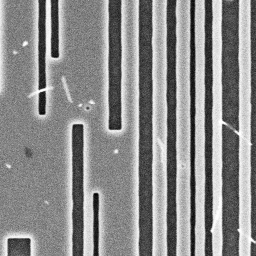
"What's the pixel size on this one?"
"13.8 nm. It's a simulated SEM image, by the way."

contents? groups of lines, slits or small figures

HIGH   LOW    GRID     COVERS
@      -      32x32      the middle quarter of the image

@@@@@@@@@@@----@@@@---@@@@--@@@-
@@@@@@@@@@@----@@@----@@@@--@@@-
@@@@@@@@@@@----@@@@---@@@@--@@@-
@@@@@@@@@@@----@@@@---@@@---@@@-
@@@@@@@@@@@---@@@@@---@@@@--@@@-
@@@@@@@@@@@---@@@@@---@@@@--@@@-
@@@@@@@@@@@---@@@@@---@@@@--@@@-
@@@@@@@@@@@---@@@@@---@@@---@@@-
@@@@@@@@@@@---@@@@@---@@@---@@@-
@@@@@@@@@@@----@@@@---@@@@--@@@-
@@@@@@@@@@@----@@@@---@@@@--@@@-
@@@@@@@@@@@----@@@@---@@@@--@@@-
@@@@@@@@@@@----@@@@---@@@@--@@@-
@@@@@@@@@@@----@@@@---@@@@--@@@-
@@@@@@@@@@@----@@@@---@@@@--@@@-
@@---@@@@@@----@@@@---@@@@--@@@-
@@---@@@@@@@--@@@@@---@@@@--@@@-
@@---@@@@@@@@@@@@@@---@@@@--@@@-
@@---@@@@@@@@@@@@@@---@@@@--@@@-
@@---@@@@@@@@@@@@@@---@@@@--@@@-
@@---@@@@@@@@@@@@@@---@@@@--@@@-
@@---@@@@@@@@@@@@@@---@@@@--@@@-
@@---@@@@@@@@@@@@@@---@@@@--@@@-
@@---@@@@@@@@@@@@@@---@@@@--@@@-
@@---@@@@@@@@@@@@@@---@@@@--@@@-
@@---@@@@@@@@@@@@@@---@@@@--@@@-
@@---@@@@@@@@@@@@@----@@@@--@@@-
@@---@@@@@@@@@@@@@----@@@@--@@@-
@@---@@@@@@@@@@@@@@---@@@@--@@@-
@@---@@@@@@@@@@@@@@---@@@@--@@@-
@@---@@@@@@@@@@@@@@---@@@@--@@@-
@@---@@@@@@@@@@@@@----@@@@--@@@-